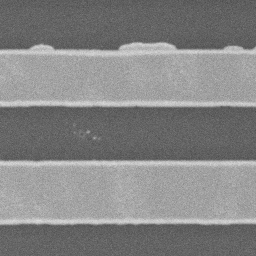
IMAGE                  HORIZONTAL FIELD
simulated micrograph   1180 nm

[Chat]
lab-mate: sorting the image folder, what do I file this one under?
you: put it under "lines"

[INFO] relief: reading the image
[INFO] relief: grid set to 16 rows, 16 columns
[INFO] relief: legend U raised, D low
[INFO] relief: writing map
DDDDDDDDDDDDDDDD
DDDDDDDDDDDDDDDD
DDDDDDDDDDDDDDDD
UUUUUUUUUUUUUUUU
UUUUUUUUUUUUUUUU
UUUUUUUUUUUUUUUU
UUUUUUUUUUUUUUUU
DDDDDDDDDDDDDDDD
DDDDDDDDDDDDDDDD
DDDDDDDDDDDDDDDD
UUUUUUUUUUUUUUUU
UUUUUUUUUUUUUUUU
UUUUUUUUUUUUUUUU
UUUUUUUUUUUUUUUU
DDDDDDDDDDDDDDDD
DDDDDDDDDDDDDDDD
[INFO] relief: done